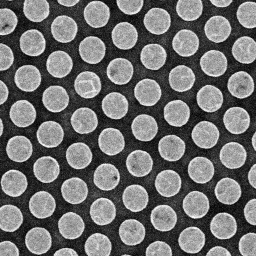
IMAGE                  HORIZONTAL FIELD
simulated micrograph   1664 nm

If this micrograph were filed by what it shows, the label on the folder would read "a regular array of raised bodies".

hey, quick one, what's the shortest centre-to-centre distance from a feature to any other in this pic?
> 224 nanometers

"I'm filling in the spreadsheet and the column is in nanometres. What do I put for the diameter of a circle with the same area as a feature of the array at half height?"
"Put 163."